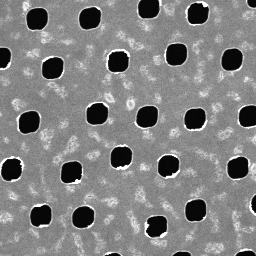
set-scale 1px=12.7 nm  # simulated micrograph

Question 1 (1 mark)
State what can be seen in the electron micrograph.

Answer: a regular array of holes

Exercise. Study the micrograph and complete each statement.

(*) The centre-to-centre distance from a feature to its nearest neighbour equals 0.613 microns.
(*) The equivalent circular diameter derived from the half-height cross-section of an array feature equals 22.1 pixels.